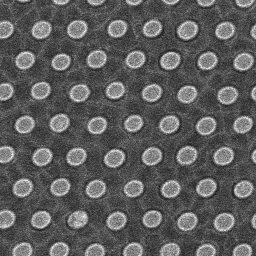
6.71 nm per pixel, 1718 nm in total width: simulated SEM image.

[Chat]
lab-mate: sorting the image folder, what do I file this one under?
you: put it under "a regular array of raised bodies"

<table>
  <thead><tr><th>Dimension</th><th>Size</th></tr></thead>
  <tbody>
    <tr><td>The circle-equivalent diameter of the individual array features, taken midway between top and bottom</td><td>0.122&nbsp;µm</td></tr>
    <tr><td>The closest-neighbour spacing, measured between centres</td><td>236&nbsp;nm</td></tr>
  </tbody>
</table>